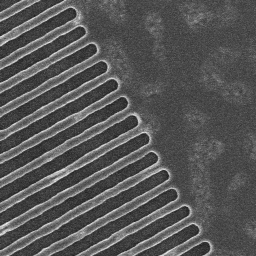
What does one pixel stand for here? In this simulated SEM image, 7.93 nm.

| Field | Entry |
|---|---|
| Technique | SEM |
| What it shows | parallel lines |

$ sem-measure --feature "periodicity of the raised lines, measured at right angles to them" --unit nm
164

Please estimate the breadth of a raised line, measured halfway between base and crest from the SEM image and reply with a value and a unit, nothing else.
67.4 nm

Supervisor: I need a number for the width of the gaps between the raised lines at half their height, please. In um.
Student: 0.0942